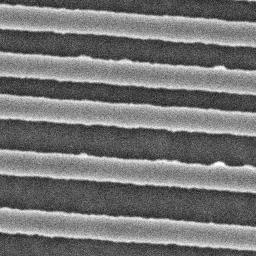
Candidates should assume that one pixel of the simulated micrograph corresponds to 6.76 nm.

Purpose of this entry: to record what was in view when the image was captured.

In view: lines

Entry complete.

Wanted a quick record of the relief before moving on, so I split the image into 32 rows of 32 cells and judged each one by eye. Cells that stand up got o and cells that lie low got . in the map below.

................................
oooooooooooooo..................
ooooooooooooooooooooooooooo.....
oooooooooooooooooooooooooooooooo
...............ooooooooooooooooo
...........................ooooo
................................
ooooooooooooo...................
oooooooooooooooooooooooooooo....
oooooooooooooooooooooooooooooooo
..............oooooooooooooooooo
............................oooo
oooooooo........................
oooooooooooooooooooooooo........
oooooooooooooooooooooooooooooooo
...........ooooooooooooooooooooo
..........................oooooo
................................
................................
ooooooooooo.....................
oooooooooooooooooooooooo...o....
oooooooooooooooooooooooooooooooo
............oooooooooooooooooooo
.........................ooooooo
................................
................................
oooooo..........................
ooooooooooooooooooooo...........
oooooooooooooooooooooooooooooooo
......o.oooooooooooooooooooooooo
......................oooooooooo
................................